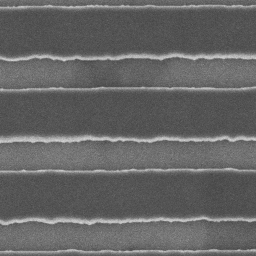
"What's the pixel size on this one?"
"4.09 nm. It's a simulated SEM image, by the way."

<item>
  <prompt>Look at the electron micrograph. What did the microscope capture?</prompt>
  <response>lines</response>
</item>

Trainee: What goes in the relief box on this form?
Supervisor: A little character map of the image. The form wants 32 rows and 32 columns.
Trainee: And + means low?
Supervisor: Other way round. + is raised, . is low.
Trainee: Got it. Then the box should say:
................................
++++++++++++++++++++++++++++++++
++++++++++++++++++++++++++++++++
++++++++++++++++++++++++++++++++
++++++++++++++++++++++++++++++++
++++++++++++++++++++++++++++++++
++++++++++++++++++++++++++++++++
.+..............................
................................
................................
................................
++++++++++++++++++++++++++++++++
++++++++++++++++++++++++++++++++
++++++++++++++++++++++++++++++++
++++++++++++++++++++++++++++++++
++++++++++++++++++++++++++++++++
++++++++++++++++++++++++++++++++
++++++++++...+++++++.++++++.++..
................................
................................
................................
++++++++++++++++++++++++++++++++
++++++++++++++++++++++++++++++++
++++++++++++++++++++++++++++++++
++++++++++++++++++++++++++++++++
++++++++++++++++++++++++++++++++
++++++++++++++++++++++++++++++++
++++++++++++++++++++++++..++++++
................................
................................
................................
++++++++++++++++++++++++++++++++